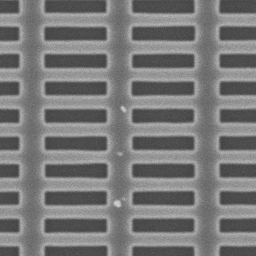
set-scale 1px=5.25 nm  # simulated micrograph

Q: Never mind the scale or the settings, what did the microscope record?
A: groups of lines, slits or small figures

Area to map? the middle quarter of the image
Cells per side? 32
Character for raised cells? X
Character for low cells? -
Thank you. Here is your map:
-----------XXXXXX---------------
XXXXXXXXXXXXXXXXXXXXXXXXXXXXXXXX
XXXXXXXXXXXXXXXXXXXXXXXXXXXXXXXX
XXXXXXXXXXXXXXXXXXXXXXXXXXXXXXXX
-----------XXXXXX---------------
-----------XXXXXX---------------
-----------XXXXXX---------------
-----------XXXXXX---------------
XXXXXXXXXXXXXXXXXXXXXXXXXXXXXXXX
XXXXXXXXXXXXXXXXXXXXXXXXXXXXXXXX
XXXXXXXXXXXXXXXXXXXXXXXXXXXXXXXX
-----------XXXXXX---------------
-----------XXXXXX---------------
-----------XXXXXX---------------
-----------XXXXXX---------------
XXXXXXXXXXXXXXXXXXXXXXXXXXXXXXXX
XXXXXXXXXXXXXXXXXXXXXXXXXXXXXXXX
XXXXXXXXXXXXXXXXXXXXXXXXXXXXXXXX
-----------XXXXXX---------------
-----------XXXXXX---------------
-----------XXXXXX---------------
-----------XXXXXX---------------
XXXXXXXXXXXXXXXXXXXXXXXXXXXXXXXX
XXXXXXXXXXXXXXXXXXXXXXXXXXXXXXXX
XXXXXXXXX-XXXXXXXXXXXXXXXXXXXXXX
-----------XXXXXX---------------
-----------XXXXXX---------------
-----------XXXXXX---------------
-----------XXXXXXX--------------
XXXXXXXXXXXXXXXXXXXXXXXXXXXXXXXX
XXXXXXXXXXXXXXXXXXXXXXXXXXXXXXXX
XXXXXXXXXXXXXXXXXXXXXXXXXXXXXXXX